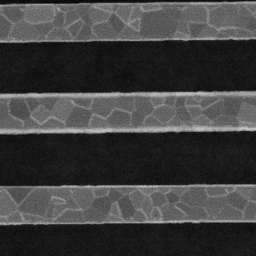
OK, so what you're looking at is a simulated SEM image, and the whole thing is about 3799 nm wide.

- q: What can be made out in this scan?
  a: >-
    lines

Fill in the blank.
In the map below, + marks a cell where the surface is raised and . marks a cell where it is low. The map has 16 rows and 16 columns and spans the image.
++++++++++++++++
++++++++++++++++
+++++++++++.....
................
................
................
++++++++++++++++
++++++++++++++++
................
................
................
................
++++++++++++++++
++++++++++++++++
................
................